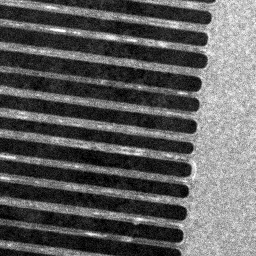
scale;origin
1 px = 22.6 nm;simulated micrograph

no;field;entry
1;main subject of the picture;parallel lines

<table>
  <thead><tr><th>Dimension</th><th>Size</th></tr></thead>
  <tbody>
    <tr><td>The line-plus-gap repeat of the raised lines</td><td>0.496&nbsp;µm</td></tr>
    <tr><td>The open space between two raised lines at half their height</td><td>6.44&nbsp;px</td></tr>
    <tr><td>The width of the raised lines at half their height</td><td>362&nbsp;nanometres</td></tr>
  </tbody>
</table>